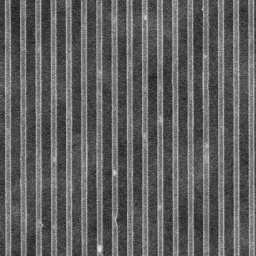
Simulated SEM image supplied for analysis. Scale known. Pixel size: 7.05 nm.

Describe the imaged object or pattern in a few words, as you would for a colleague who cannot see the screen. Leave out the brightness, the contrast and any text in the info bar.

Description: parallel lines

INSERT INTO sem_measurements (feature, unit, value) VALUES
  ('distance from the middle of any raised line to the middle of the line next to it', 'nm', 107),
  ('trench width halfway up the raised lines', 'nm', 72.3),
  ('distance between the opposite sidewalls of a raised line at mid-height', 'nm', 34.4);